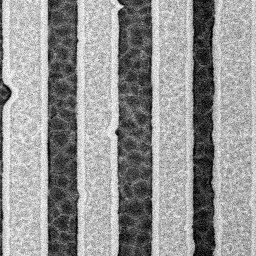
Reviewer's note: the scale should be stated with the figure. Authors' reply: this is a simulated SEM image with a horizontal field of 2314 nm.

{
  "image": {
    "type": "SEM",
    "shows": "one or a few lines or trenches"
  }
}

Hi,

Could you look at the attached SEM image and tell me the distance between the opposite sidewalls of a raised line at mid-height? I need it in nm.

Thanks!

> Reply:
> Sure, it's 320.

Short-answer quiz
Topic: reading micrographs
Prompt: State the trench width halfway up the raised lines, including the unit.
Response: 0.32 microns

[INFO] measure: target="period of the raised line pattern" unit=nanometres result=646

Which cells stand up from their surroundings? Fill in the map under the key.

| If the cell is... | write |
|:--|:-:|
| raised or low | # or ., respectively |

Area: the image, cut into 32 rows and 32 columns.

.#####....#####....#####...#####
.#####....#####....#####...#####
.#####....####.....#####...#####
.#####....####.....#####...#####
.#####....####.....#####...#####
.#####....####.....#####...#####
.#####....#####....#####...#####
.#####....####.....#####...#####
.#####....####.....#####...#####
.#####....####.....#####...#####
.#####....####.....#####...#####
..####....####.....#####...#####
.#####....####.....#####...#####
.#####....####.....#####...#####
.#####....####.....#####...#####
.#####....####.....#####...#####
.#####....####.....#####...#####
.#####....####.....#####...#####
.#####....####.....#####...#####
.#####....####.....#####...#####
.#####....####......####...#####
.#####....####.....#####...#####
.#####....####.....#####...#####
.#####....####.....#####...#####
.#####....####.....#####...#####
.#####....####.....#####...#####
.####.....####.....#####...#####
.#####....####.....#####...#####
.#####....####.....#####...#####
.#####....####.....#####...#####
.#####....####.....#####...#####
.#####....####.....#####...#####